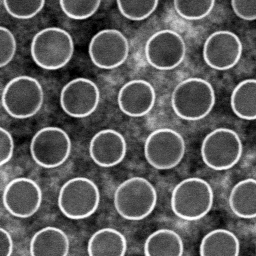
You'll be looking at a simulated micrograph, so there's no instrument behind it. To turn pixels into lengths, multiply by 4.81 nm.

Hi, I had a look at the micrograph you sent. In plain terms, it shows a regular array of raised bodies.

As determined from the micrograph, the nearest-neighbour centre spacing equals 272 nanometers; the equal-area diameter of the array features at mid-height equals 39.4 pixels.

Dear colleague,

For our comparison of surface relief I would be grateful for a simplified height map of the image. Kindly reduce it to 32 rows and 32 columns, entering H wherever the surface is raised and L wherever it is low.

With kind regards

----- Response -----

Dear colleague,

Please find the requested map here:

LHHHHLLLHHHHLLLHHHHHLLHHHHHLLHHH
LHHHHLLLHHHHLLLHHHHLLLHHHHLLLLHH
LLLLLLLLLLLLLLLLLLLLLLLLLLLLLLLL
LLLLLLLLLLLLLLLLLLLLLLLLLLLLLLLL
HLLLLHHHHLLLHHHLLLLHHHLLLLHHHLLL
HHLLHHHHHLLHHHHHLLHHHHHLLLHHHHLL
HHLLHHHHHLLHHHHHLLHHHHHLLLHHHHLL
HLLLHHHHLLLLHHHLLLLHHHHLLLHHHHLL
LLLLLLHLLLLLLLLLLLLLHLLLLLLHLLLL
LLLLLLLLLLLLLLLLLLLLLLLLLLLLLLLL
LHHHHLLLLHHHLLLLHHHLLLLHHHLLLLHH
LHHHHLLLHHHHLLLHHHHLLLHHHHHLLHHH
HHHHHLLLHHHHLLLHHHHLLLHHHHHLLHHH
LHHHHLLLHHHHLLLHHHHLLLHHHHLLLHHH
LLHHLLLLLLLLLLLLLLLLLLHHHLLLLLHH
LLLLLLLLLLLLLLLLLLLLLLLLLLLLLLLL
HLLLLHHHLLLLLHLLLLLHHHLLLLLHHLLL
HLLLHHHHHLLLHHHLLLHHHHHLLLHHHHLL
HHLLHHHHHLLHHHHHLLHHHHHLLHHHHHLL
HLLLHHHHLLLHHHHLLLHHHHHLLHHHHHLL
LLLLLHHLLLLLHHLLLLLHHHLLLLHHHLLL
LLLLLLLLLLLLLLLLLLLLLLLLLLLLLLLL
LLHHLLLLLHHLLLLLHHLLLLLHHLLLLLLH
LHHHHLLLHHHHLLLHHHHLLLHHHHLLLHHH
LHHHHLLHHHHHLLLHHHHLLLHHHHLLLHHH
LHHHHLLHHHHHLLHHHHHLLLHHHHLLLHHH
LHHHLLLLHHHHLLLHHHHLLLHHHHLLLHHH
LLLLLLLLLLLLLLLLLLLLLLLLLLLLLLLL
LLLLLLHLLLLLLLLLLLLLLLLLLLLLLLLL
HLLLHHHHLLLLHHHLLLLHHHLLLLHHHLLL
HLLLHHHHLLLHHHHHLLHHHHHLLHHHHHLL
HLLLHHHHLLLHHHHLLLHHHHHLLHHHHHLL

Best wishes